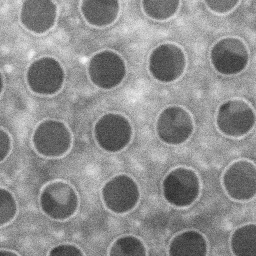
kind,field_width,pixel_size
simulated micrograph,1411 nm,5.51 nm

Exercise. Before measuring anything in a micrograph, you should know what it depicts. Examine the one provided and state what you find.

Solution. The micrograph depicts a regular array of raised bodies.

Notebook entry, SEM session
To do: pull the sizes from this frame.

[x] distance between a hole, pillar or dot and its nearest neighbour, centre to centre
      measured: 0.338 micrometres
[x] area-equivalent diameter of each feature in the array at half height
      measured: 227 nanometres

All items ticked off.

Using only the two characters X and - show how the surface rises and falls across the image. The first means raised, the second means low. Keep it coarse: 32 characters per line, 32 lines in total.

---XXXX---XXXXX---XXXXX---XXXX--
--XXXXX---XXXXX---XXXX-----XX---
--XXXXX----XXXX----XX-----------
---XXXX-----X-------------------
--------------------------------
--------------------XX-----XXXX-
------------XXX----XXXX---XXXXX-
----XXX---XXXXXX---XXXX---XXXXX-
---XXXXX---XXXXX--XXXXX----XXXX-
---XXXXX---XXXXX---XXXX---------
X--XXXXX----XXX-----------------
----XXX-------------------------
----------------------------XXX-
---------------------XX----XXXXX
-------------XXX----XXXX---XXXXX
-----XXX----XXXX---XXXXX---XXXXX
X---XXXXX---XXXXX--XXXXX---XXXX-
X---XXXXX---XXXXX---XXXX--------
X---XXXXX----XXX----------------
X----XXX------------------------
-----------------------------XXX
---------------------XXX----XXXX
-------X------XXX---XXXXX---XXXX
X----XXXX----XXXX---XXXXX---XXXX
XX---XXXXX---XXXXX--XXXXX----XXX
XX---XXXXX---XXXX----XXX--------
XX---XXXXX----XX----------------
XX-----X------------------------
------------------------------XX
---------------XX-----XXXX---XXX
--------X-----XXXX---XXXXX---XXX
XX----XXXX----XXXX---XXXXX---XXX